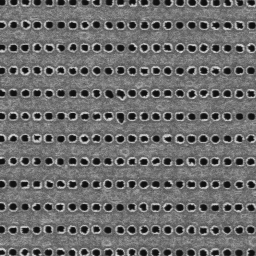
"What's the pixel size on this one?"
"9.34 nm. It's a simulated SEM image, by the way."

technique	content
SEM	a regular array of holes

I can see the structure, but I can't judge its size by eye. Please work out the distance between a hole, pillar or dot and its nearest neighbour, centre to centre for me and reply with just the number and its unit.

109 nm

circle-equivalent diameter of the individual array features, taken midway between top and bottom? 7.04 pixels